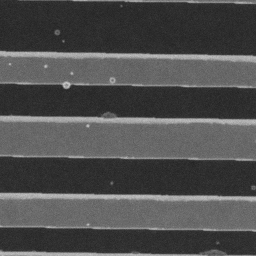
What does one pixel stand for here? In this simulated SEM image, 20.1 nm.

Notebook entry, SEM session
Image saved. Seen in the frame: lines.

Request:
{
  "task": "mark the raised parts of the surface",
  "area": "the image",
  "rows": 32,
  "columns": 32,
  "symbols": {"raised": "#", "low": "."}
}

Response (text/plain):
................................
................................
................................
................................
................................
................................
................................
################################
################################
################################
.......#########################
................................
................................
................................
................................
################################
################################
################################
################################
.###############################
................................
................................
................................
................................
######..........................
################################
################################
################################
...........#####################
................................
................................
................................